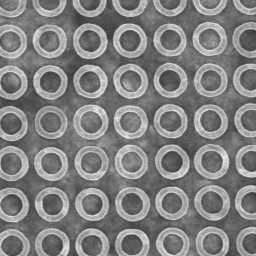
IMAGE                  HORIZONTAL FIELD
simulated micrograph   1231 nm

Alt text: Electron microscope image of a regular array of ring-shaped raised bodies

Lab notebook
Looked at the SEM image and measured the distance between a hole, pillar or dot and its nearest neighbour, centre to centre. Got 191 nanometres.